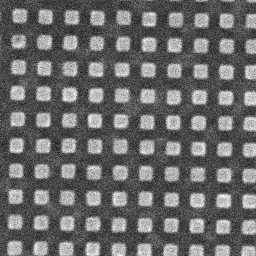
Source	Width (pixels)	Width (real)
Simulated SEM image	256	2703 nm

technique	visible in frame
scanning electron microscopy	a regular array of raised bodies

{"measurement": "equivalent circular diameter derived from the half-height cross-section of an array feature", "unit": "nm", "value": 153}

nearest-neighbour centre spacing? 269 nm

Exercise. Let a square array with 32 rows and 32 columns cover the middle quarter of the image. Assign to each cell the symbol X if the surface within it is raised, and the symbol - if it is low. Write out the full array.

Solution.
XXX----XXX---XXX---XXXX---XXX---
XXX----XXX---XXX---XXXX---XXX---
XXX----XXX---XXX---XXXX---XXX---
--------------------------------
--------------------------------
--------------------------------
XXX----XX----XXX----------------
XXX---XXXX---XXX----XX----XXX---
XXX---XXXX---XXX---XXX----XXX---
-------------XX-----XX----XXX---
--------------------------------
--------------------------------
--------------------------------
XXX---XXX----XXX---XXX----XXX---
XXX---XXX----XXX---XXX----XXX---
XXX---XXX----XXX---XXX----XXX---
--------------------------------
--------------------------------
--------------------------------
XXX---XXX----XXX---XXX----X-----
XXX---XXX----XXX---XXX----XXX---
XXX---XXX---XXXX---XXX----XXX---
--------------------------XX----
--------------------------------
--------------------------------
XX------------------------------
XXX---XXX----XXX---XXX---XXXX---
XXX---XXX----XXX---XXX---XXXX---
------XXX----XX----XXX---XXX----
--------------------------------
--------------------------------
--------------------------------